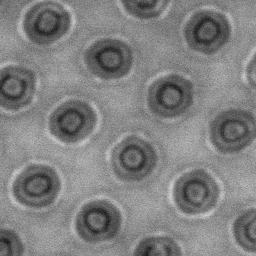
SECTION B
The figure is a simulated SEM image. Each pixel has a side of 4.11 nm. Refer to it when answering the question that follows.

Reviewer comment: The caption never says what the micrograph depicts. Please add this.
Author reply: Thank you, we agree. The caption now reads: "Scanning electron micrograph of a regular array of ring-shaped raised bodies with a dot in the middle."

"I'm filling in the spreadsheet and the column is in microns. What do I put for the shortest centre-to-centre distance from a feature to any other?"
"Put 0.294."